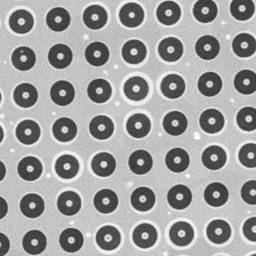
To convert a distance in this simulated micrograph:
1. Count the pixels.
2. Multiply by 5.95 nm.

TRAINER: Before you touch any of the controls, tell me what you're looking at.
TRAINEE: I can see an array of small figures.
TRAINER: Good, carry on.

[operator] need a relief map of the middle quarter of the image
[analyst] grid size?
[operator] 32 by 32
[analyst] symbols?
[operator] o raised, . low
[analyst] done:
.oooooo..oooooooo.oooooooooooooo
oooooooooooooooooooooooooooooooo
oooooooooooooooooo.ooooooo..oooo
ooooooooo.oooooo....oooo......oo
.oooooo....oooo......ooo......oo
..oooo......oo........oo...o...o
...ooo..o...oo........oo......oo
...ooo......ooo.......oo......oo
...ooo......ooo......oooo...oooo
..oooooo...oooooo...oooooooooooo
oooooooooooooooooooooooooooooooo
oooooooooooooooooooooooooooooooo
ooooooooooooooooo....oooo.....oo
.oooooo.....oooo......ooo......o
...ooo......ooo.......oo...o...o
...ooo...o...oo...o...ooo......o
o..ooo.......oo.......ooo......o
...oooo.....oooo.....ooooo....oo
...oooo....ooooooo..oooooooooooo
.ooooooooooooooooooooooooooooooo
oooooooooooooooooooooooooooooooo
oooooooooooooooooo..oooooo....oo
..oooooo....ooooo.....oooo.....o
....ooo......ooo......ooo...o..o
....oo.......ooo..oo..ooo...o..o
o....o...o...ooo......oooo.....o
....ooo......oooo.....oooo....oo
....ooo.....oooooo..oooooooooooo
...oooooo.oooooooooooooooooooooo
oooooooooooooooooooooooooooooooo
ooooooooooooooooooooooooooo....o
..ooooooo...ooooo.....oooo......